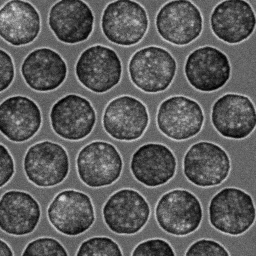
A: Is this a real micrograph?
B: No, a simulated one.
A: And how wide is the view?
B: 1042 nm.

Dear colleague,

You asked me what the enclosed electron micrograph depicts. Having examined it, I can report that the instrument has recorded a regular array of holes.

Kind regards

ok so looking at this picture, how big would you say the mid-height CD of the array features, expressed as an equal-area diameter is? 0.183 um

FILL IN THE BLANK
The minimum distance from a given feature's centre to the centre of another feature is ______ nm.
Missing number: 215